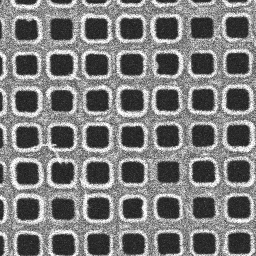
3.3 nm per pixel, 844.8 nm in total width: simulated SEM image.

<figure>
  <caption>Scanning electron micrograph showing a regular array of holes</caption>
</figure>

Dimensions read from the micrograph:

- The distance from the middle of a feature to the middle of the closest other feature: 0.116 micrometres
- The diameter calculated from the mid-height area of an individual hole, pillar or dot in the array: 77.4 nanometres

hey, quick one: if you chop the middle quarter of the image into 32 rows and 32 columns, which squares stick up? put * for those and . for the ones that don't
..***......***......****.....***
..***......***......***.....****
.*****.....****....*****....****
********************************
********************************
********************************
.*******.******....*****....****
..****.....***......***......***
..***......***......***......***
..***......***......***......***
..****.....***......***......***
..****.....****....*****....****
********************************
********************************
********************************
*****************..*****....****
..****.....****.....***......***
..****.....***......***......***
..****.....***......***......***
..****.....***......***......***
..****.....****.....****....****
********************************
********************************
********************************
********..*****....*****....****
..****.....****.....***......***
..****.....***......***......***
..****.....***......***......***
...***.....***......***......***
..****.....****.....****....****
********************************
********************************